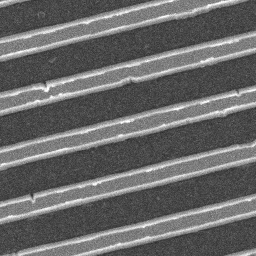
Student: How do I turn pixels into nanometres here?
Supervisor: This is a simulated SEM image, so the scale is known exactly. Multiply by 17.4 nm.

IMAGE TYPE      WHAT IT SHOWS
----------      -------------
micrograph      parallel lines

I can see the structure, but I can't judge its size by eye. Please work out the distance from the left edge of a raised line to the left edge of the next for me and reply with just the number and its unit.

921 nanometres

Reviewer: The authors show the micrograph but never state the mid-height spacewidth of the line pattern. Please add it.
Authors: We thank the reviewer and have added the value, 605 nm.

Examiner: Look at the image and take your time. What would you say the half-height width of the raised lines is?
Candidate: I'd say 0.311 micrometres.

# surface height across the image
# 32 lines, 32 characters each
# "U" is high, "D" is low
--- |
DDDDDDDDDDDDDDDDDDUUUUUUUUUUDDDD
DDDDDDDDDDDDDDDUUUUUUUUUUDDDDDDD
DDDDDDDDDDDUUUUUUUUUDDDDDDDDDDDD
DDDDDDDUUUUUUUUUDDDDDDDDDDDDDDDD
DDUUUUUUUUUUDDDDDDDDDDDDDDDDDDDU
UUUUUUUUDDDDDDDDDDDDDDDDDDUUUUUU
UUUUDDDDDDDDDDDDDDDDDDUUUUUUUUUD
DDDDDDDDDDDDDDDDDDUUUUUUUUUDDDDD
DDDDDDDDDDDDDDUUUUUUUUUUDDDDDDDD
DDDDDDDDDDUUUUUUUUUDDDDDDDDDDDDD
DDDDDDUUUUUUUUUDDDDDDDDDDDDDDDDD
DDUUUUUUUUUDDDDDDDDDDDDDDDDDDDUU
UUUUUUUDDDDDDDDDDDDDDDDDDDUUUUUU
UUUDDDDDDDDDDDDDDDDDDUUUUUUUUUDD
DDDDDDDDDDDDDDDDDUUUUUUUUUUDDDDD
DDDDDDDDDDDDDUUUUUUUUUDDDDDDDDDD
DDDDDDDDDUUUUUUUUUDDDDDDDDDDDDDD
DDDDDUUUUUUUUUDDDDDDDDDDDDDDDDDD
DUUUUUUUUUDDDDDDDDDDDDDDDDDDDUUU
UUUUUUDDDDDDDDDDDDDDDDDDDUUUUUUU
UUDDDDDDDDDDDDDDDDDDUUUUUUUUUUDD
DDDDDDDDDDDDDDDDUUUUUUUUUUDDDDDD
DDDDDDDDDDDDUUUUUUUUUUDDDDDDDDDD
DDDDDDDDUUUUUUUUUDDDDDDDDDDDDDDD
DDDDUUUUUUUUUDDDDDDDDDDDDDDDDDDD
UUUUUUUUUDDDDDDDDDDDDDDDDDDDUUUU
UUUUUDDDDDDDDDDDDDDDDDDDUUUUUUUU
UDDDDDDDDDDDDDDDDDDDUUUUUUUUUDDD
DDDDDDDDDDDDDDDDUUUUUUUUUDDDDDDD
DDDDDDDDDDDUUUUUUUUUUDDDDDDDDDDD
DDDDDDDUUUUUUUUUDDDDDDDDDDDDDDDD
DDDUUUUUUUUUDDDDDDDDDDDDDDDDDDDU